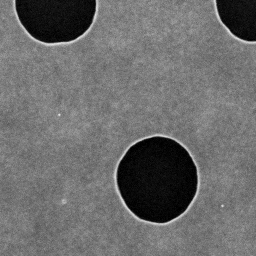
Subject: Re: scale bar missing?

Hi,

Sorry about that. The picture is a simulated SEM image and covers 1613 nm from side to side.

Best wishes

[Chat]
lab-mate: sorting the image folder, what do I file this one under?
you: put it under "holes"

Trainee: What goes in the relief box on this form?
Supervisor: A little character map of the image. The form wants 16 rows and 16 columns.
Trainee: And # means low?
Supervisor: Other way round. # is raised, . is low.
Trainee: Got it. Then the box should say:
#.....########..
#.....########..
##...##########.
################
################
################
################
################
################
########....####
#######.....####
#######.....####
########....####
#########..#####
################
################